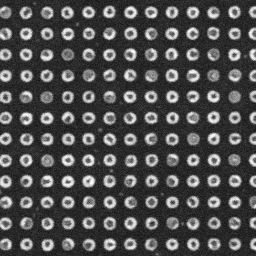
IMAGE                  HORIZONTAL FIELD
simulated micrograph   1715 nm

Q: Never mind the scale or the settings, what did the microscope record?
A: a regular array of raised bodies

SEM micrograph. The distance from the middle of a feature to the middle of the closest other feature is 138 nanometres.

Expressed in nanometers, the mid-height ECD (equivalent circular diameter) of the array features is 78.2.